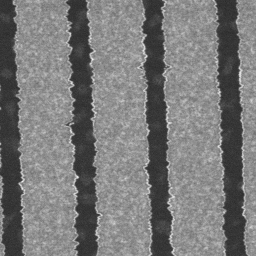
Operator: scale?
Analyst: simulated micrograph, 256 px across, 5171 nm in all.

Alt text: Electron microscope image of one or a few lines or trenches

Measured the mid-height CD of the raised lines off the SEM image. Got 444 nm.